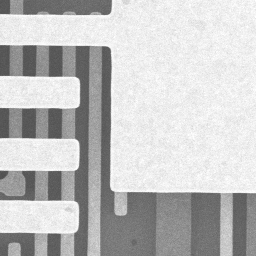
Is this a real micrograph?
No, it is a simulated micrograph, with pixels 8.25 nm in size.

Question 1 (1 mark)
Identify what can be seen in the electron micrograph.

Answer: wiring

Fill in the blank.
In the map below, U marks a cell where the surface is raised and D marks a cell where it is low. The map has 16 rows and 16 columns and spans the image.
DDDDDDDUUUUUUUUU
UUUUUUUUUUUUUUUU
UUUUUUUUUUUUUUUU
DDDDDDDUUUUUUUUU
DDDDDDDUUUUUUUUU
UUUUUDDUUUUUUUUU
UUUUUDDUUUUUUUUU
DDDDDDDUUUUUUUUU
DDDDDDDUUUUUUUUU
UUUUUDDUUUUUUUUU
UUUUUDDUUUUUUUUU
DDDDDDDUUUUUUUUU
DDDDDDDDDDDDDDDD
UUUUUDDDDDDDDDDD
DUUUDDDDDDDDDDDD
DDDDDDDDDDDDDDDD